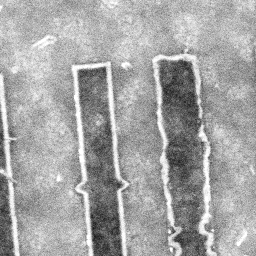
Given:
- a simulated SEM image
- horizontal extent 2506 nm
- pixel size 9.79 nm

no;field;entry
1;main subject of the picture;one or a few lines or trenches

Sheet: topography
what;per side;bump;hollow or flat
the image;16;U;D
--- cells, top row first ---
DDDDDDDDDDDDDDDD
DDDDDDDDDDDDDDDD
DDDDDDDDDDDDDDDD
DDDDDDDDDDDDDDDD
DDDDDUUDDDUUDDDD
DDDDDUUDDDUUDDDD
DDDDDUUDDDUUDDDD
DDDDDUUDDDUUUDDD
DDDDDUUDDDUUUDDD
DDDDDUUDDDUUUDDD
UDDDDUUDDDUUUDDD
UDDDDUUUDDUUUDDD
UDDDDUUDDDDUUDDD
UDDDDUUUDDDUUDDD
UDDDDDUUDDDUUDDD
UDDDDDUUDDDUUDDD